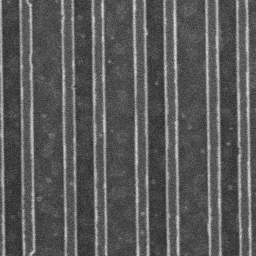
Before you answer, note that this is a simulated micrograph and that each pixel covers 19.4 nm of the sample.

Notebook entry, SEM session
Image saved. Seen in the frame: parallel lines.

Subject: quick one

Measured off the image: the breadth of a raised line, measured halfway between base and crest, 199 nm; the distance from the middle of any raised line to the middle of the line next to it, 700 nanometers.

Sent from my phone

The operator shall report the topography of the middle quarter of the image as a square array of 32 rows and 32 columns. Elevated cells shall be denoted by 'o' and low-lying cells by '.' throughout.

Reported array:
oo.....ooo........oo.....ooo....
oo.....ooo........oo.....ooo....
oo.....ooo........oo.....ooo....
oo.....ooo........oo.....ooo....
oo.....ooo........ooo....ooo....
oo.....ooo........ooo....ooo....
oo......oo........ooo....ooo....
oo......oo........ooo.....oo....
oo......oo........ooo.....oo....
oo......oo........oo......oo....
oo......oo........oo......oo....
oo......oo........oo......oo....
oo......oo........oo......oo....
oo......oo........oo......oo....
oo......oo........oo......oo....
oo......oo........oo......oo....
oo......oo........oo......oo....
ooo.....oo........ooo.....oo....
ooo.....oo........ooo.....oo....
ooo.....oo........ooo.....oo....
ooo.....oo........ooo.....oo....
ooo.....oo........ooo.....oo....
ooo.....oo........ooo.....oo....
ooo.....oo........ooo.....oo....
ooo.....oo........ooo.....oo....
ooo.....oo........ooo.....oo....
ooo.....oo........ooo.....oo....
ooo.....oo........ooo.....oo....
ooo.....oo........ooo.....oo....
ooo.....oo........ooo.....oo....
ooo.....oo........ooo.....oo....
ooo.....oo........ooo.....oo....